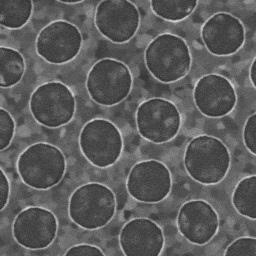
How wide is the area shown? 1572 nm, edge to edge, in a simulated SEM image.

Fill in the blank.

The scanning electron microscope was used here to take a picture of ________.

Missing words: a regular array of holes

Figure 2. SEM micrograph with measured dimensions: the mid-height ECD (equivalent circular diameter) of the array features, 272 nanometers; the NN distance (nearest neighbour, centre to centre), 376 nm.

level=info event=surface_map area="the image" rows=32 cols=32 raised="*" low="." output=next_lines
....********.....**......*******
....********.....**.....********
...*********.....****.****....**
*.****....**.....********.....**
*****.....***....***..***.....**
*****.....*********....***....**
..***.....********......**...***
...***...****.****......********
...*********....**......*******.
...********.....***....***.****.
..****..***.....*********....***
****.....**.....********.....***
****.....***...****..***......**
****.....********.....***....***
.***.....********.....****..***.
..***...***...***.....*********.
..********.....**.....*********.
.*********.....****..***...****.
.***...***.....********.....***.
***.....***....********......***
**......****..***...***......***
**......********.....***....****
.**....*********.....***....**..
.***..****...***.....*********..
.********.....***....********...
.********.....*********...***...
***...***.....********.....***..
**.....**.....***..***.....*****
**.....****.***.....**.....*****
**.....********.....***....*****
***...*********.....*********...
********.....**.....********....